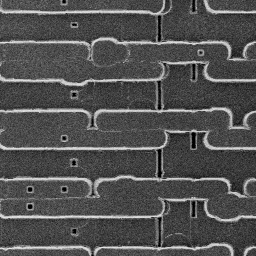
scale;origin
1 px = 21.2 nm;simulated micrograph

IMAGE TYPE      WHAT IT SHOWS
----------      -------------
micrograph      wiring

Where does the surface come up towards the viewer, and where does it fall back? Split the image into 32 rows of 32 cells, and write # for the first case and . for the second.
#####################.....######
.....####.........##.........###
................................
................................
................................
###########.################...#
#############################.##
################################
####################......######
####################......######
.........#......................
................................
................................
................................
###########.#################..#
#############################..#
#####################....#######
#####################.....######
####################......######
................................
................................
................................
###########..###############...#
#############################..#
################################
#####################.....######
####################......######
...........................##...
................................
................................
................................
###########.#################..#